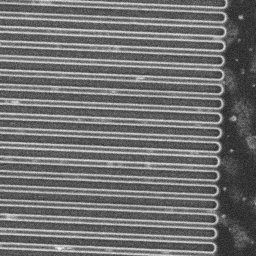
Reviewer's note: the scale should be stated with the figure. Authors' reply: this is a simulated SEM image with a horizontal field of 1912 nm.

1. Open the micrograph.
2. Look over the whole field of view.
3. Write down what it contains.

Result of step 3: parallel lines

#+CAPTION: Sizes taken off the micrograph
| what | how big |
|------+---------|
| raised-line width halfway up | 43.9 nm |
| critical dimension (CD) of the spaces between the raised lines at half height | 8.74 pixels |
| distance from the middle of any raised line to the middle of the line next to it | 108 nanometers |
